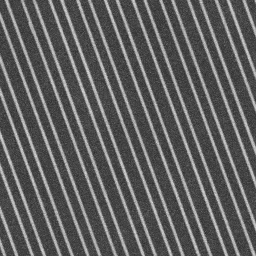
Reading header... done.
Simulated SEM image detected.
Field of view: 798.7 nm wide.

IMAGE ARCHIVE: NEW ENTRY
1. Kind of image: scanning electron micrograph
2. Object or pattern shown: parallel lines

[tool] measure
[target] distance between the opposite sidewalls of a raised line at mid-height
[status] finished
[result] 7.7 nm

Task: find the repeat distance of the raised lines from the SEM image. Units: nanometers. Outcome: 40.5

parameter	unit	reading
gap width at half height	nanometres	27.1